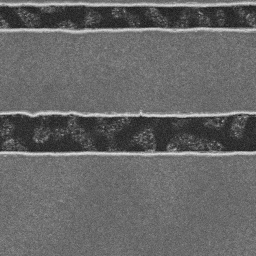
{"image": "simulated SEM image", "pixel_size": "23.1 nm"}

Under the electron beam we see one or a few lines or trenches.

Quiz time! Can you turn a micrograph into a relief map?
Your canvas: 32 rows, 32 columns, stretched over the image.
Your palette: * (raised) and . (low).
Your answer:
.**.*************..********.....
................................
................................
................................
********************************
********************************
********************************
********************************
********************************
********************************
********************************
********************************
********************************
********************************
................................
................................
................................
................................
................................
********************************
********************************
********************************
********************************
********************************
********************************
********************************
********************************
********************************
********************************
********************************
********************************
********************************